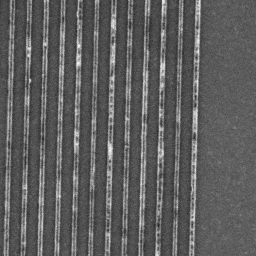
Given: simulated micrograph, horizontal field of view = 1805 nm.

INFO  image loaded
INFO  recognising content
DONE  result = parallel lines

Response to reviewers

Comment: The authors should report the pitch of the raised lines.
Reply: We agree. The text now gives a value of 119 nm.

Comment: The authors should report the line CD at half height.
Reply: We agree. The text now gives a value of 3.5 px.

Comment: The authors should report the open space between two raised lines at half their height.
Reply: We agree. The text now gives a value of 0.0916 microns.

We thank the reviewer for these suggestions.